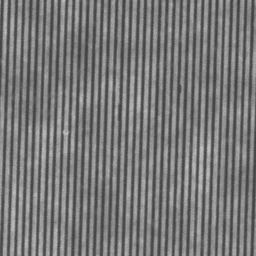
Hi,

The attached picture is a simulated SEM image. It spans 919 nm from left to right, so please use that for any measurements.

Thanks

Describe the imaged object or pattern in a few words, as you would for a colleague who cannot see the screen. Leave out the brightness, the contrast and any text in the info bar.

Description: parallel lines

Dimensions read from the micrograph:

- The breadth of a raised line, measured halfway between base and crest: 11.2 nanometres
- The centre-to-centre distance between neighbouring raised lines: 25.7 nm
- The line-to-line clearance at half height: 13.9 nm